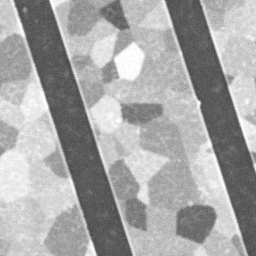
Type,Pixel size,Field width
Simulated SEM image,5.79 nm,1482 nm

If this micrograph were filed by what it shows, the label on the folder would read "one or a few lines or trenches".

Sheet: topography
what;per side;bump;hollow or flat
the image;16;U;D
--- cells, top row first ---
UDDUUUUUUUDDDUUU
UDDDUUUUUUUDDUUU
UUDDUUUUUUUDDUUU
UUDDUUUUUUUDDDUU
UUDDDUUUUUUUDDUU
UUUDDUUUUUUUDDUU
UUUDDUUUUUUUDDDU
UUUDDDUUUUUUUDDU
UUUUDDUUUUUUUDDU
UUUUDDUUUUUUUDDD
UUUUDDDUUUUUUUDD
UUUUUDDUUUUUUUDD
UUUUUDDUUUUUUUDD
UUUUUDDDUUUUUUUD
UUUUUDDDUUUUUUUD
UUUUUUDDUUUUUUUD